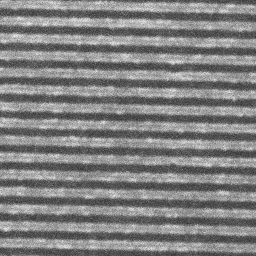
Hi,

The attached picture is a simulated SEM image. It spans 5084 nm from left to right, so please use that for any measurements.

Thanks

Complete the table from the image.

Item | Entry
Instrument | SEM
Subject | parallel lines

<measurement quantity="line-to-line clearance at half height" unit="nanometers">204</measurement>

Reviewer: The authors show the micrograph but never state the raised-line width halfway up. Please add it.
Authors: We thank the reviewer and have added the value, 149 nanometers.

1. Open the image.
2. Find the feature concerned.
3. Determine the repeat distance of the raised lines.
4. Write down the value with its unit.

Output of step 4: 339 nm